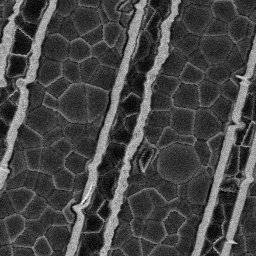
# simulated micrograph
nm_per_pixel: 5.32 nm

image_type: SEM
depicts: one or a few lines or trenches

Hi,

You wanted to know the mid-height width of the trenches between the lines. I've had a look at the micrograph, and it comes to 0.468 micrometres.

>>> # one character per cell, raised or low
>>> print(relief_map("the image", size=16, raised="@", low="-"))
-@@------@@-----
-@@-----@@@-----
@@------@@------
@@------@@------
@@------@@------
@@-----@@------@
@------@@------@
@------@@------@
@-----@@@-----@@
@-----@@------@@
------@@------@@
------@@------@-
-----@@------@@-
-----@@------@@-
-----@@------@--
----@@@-----@@--